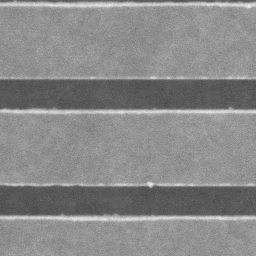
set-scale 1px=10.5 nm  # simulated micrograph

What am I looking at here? lines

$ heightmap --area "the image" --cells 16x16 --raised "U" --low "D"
UUUUUUUUUUUUUUUU
UUUUUUUUUUUUUUUU
UUUUUUUUUUUUUUUU
UUUUUUUUUUUUUUUU
UUUUUUUUUUUUUUUU
DDDDDDDDDDDDDDDD
DDDDDDDDDDDDDDDD
UUUUUUUUUUUUUUUU
UUUUUUUUUUUUUUUU
UUUUUUUUUUUUUUUU
UUUUUUUUUUUUUUUU
UUUUUUUUUUUUUUUU
DDDDDDDDDDDDDDDD
DDDDDDDDDDDDDDDD
UUUUUUUUUUUUUUUU
UUUUUUUUUUUUUUUU